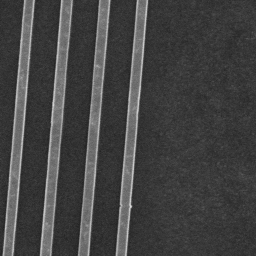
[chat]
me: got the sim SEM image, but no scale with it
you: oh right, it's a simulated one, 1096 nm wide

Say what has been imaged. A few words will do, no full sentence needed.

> parallel lines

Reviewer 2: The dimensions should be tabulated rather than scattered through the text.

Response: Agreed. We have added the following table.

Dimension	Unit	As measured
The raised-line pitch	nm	161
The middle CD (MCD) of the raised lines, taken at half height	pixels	10.2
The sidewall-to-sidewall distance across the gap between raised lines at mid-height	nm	119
